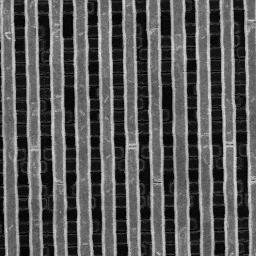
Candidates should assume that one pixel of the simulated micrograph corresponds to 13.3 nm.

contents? wiring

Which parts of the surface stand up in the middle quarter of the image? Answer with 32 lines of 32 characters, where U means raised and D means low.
DDDUUUDDDUUUDDDUUUDDDUUUDDDUUUDD
DDDUUUDDDUUUDDDUUUDDDUUUDDDUUUDD
DDDUUUDDDUUUDDDUUUDDDUUUDDDUUUDD
DDDUUUDDDUUUDDDUUUDDDUUUDDDUUUDD
DDDUUUDDDUUUDDDUUUDDDUUUDDDUUUDD
DDDUUUDDDUUUDDDUUUDDDDUUDDDUUUDD
DDDUUUDDDUUUDDDUUUDDDDUUDDDUUUDD
DDDUUUDDDUUUDDDUUUDDDDUUDDDDUUDD
DDDUUUDDDUUUDDDUUUDDDDUUDDDDUUDD
DDDUUUDDDUUUDDDUUUDDDDUUDDDDUUDD
DDDUUUDDDUUUDDDUUUDDDDUUDDDDUUDD
DDDUUUDDDUUUDDDUUUDDDDUUDDDDUUDD
DDDUUUDDDUUUDDDUUUDDDDUUDDDDUUDD
DDDUUUDDDUUUDDDUUUDDDDUUDDDDUUDD
DDDUUUDDDUUUDDDUUUDDDDUUDDDDUUUD
DDDUUUDDDUUUDDDUUUDDDDUUDDDUUUUD
DDDUUUDDDUUUDDDUUUDDDDUUDDDUUUUD
DDDUUUDDDUUUDDDDUUDDDDUUDDDUUUUD
DDDUUUDDDDUUDDDDUUDDDDUUDDDDUUDD
DDDUUUDDDDUUDDDDUUDDDDUUDDDDUUUD
DDDUUUDDDUUUDDDDUUDDDDUUUDDDUUUD
DDDUUUDDDUUUDDDDUUDDDDUUUDDDUUUD
DDDUUUDDDUUUDDDDUUDDDDUUUDDDUUUD
DDDUUUDDDDUUDDDDUUDDDDUUUDDDUUUD
DDDUUUDDDDUUDDDDUUDDDDUUUDDDUUUD
DDDUUUDDDDUUDDDDUUDDDDUUUDDDUUUD
DDDUUUDDDDUUDDDDUUDDDDUUUDDDUUUD
DDDUUUDDDDUUDDDDUUDDDDUUDDDDUUUD
DDDDUUDDDDUUDDDDUUDDDDUUUDDDUUUD
DDDDUUDDDDUUUDDDUUDDDDUUUDDDUUUD
DDDUUUDDDDUUUDDDUUDDDDUUUDDDUUUD
DDDUUUDDDDUUUDDDUUDDDDUUUDDDUUUD